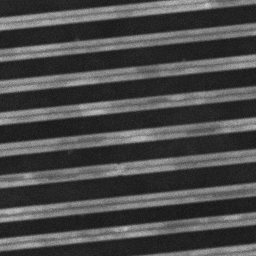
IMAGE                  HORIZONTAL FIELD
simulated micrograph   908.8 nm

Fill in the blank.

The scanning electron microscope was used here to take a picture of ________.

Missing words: parallel lines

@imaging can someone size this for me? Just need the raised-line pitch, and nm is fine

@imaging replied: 111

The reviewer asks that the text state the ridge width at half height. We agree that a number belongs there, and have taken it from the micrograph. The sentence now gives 0.0392 microns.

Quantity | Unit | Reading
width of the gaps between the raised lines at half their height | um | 0.0724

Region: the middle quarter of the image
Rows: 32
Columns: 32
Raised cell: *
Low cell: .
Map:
........................********
...............*****************
.....***********************....
*******************.............
*********.......................
................................
................................
................................
.....................**.********
............********************
....*********************.......
****************................
********........................
................................
................................
................................
.......................*********
.............*******************
...*********************........
***************.................
*****...........................
................................
................................
.............................***
....................************
..........**********************
************************........
**************..................
****............................
................................
................................
................................